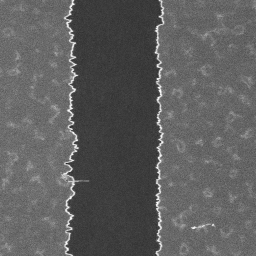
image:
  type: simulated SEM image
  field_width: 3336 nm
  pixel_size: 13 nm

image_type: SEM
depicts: one or a few lines or trenches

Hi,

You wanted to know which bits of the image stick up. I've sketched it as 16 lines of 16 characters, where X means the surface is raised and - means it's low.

XXXX------XXXXXX
XXXX------XXXXXX
XXXXX-----XXXXXX
XXXXX-----XXXXXX
XXXXX-----XXXXXX
XXXXX-----XXXXXX
XXXX------XXXXXX
XXXX------XXXXXX
XXXXX-----XXXXXX
XXXXX-----XXXXXX
XXXX------XXXXXX
XXXXX-----XXXXXX
XXXX------XXXXXX
XXXX------XXXXXX
XXXX------XXXXXX
XXXX------XXXXXX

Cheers